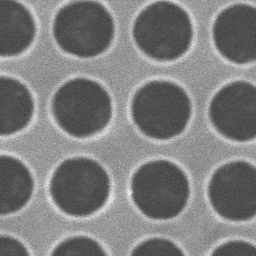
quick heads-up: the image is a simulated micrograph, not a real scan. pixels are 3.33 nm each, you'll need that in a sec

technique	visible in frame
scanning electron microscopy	holes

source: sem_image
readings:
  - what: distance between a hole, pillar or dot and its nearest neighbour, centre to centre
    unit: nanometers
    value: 263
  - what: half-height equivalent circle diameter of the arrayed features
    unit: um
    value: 0.201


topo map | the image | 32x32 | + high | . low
...+++++.....++++++...++++++++++
....+++.......++++.....+++++....
....+++.......+++.......+++.....
....+++.......+++.......+++.....
....+++.......+++.......+++.....
....+++.......+++.......+++.....
...+++++.....+++++.....++++.....
+++++++++++++++++++...++++++....
++++++++++++++++++++++++++++++++
.+++++++++++++++++++++++++++++++
...+++++....++++++....++++++...+
....+++......++++......++++.....
....+++.......+++.......++......
....++........++........++......
....+++.......+++.......++......
...++++.......+++......+++......
..++++++.....+++++.....++++.....
+++++++++++++++++++++++++++++..+
++++++++++++++++++++++++++++++++
.++++++++.++++++++++++++++++++++
...+++++.....+++++....++++++...+
....+++......++++......++++.....
....++........++.......+++......
....++........++........++......
....++........++........++......
...++++......++++......+++......
..++++++....++++++.....++++.....
++++++++++++++++++++++++++++...+
++++++++++++++++++++++++++++++++
.++++++++.++++++++++++++++++++++
...++++.....+++++.....++++++...+
...+++.......+++.......++++.....